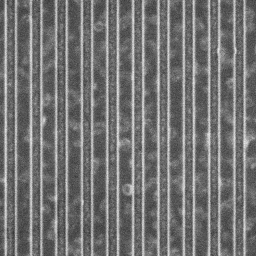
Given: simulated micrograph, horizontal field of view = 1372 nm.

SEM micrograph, parallel lines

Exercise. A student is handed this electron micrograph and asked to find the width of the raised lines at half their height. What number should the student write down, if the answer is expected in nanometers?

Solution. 88.7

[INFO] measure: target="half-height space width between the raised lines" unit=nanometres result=46.9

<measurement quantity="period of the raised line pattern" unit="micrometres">0.136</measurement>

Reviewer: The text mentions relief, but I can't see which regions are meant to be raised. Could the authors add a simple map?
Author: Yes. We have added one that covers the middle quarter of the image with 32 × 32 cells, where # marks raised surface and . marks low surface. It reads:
.###...####..####...####..####..
.###...####..####...####..####..
.###...####..####...####..####..
.###...####..####...####..####..
.###...####..####...####..####..
.###...####..####...####..####..
.###...####..####...####..####..
.###...####..####...####..####..
.###...####..####...####..####..
.###...####..####...####..####..
.###...####..####...####..####..
.###...####..####...####..####..
.###...####..####...####..####..
.###...####..####...####..####..
.###...####..####...####..####..
.###...####..####...####..####..
.###...####..####...####..####..
.###...####..####...####..####..
.###...####..####...####..####..
.###...####..####...####..####..
.###...####..####...####..####..
.###...####..####...####..####..
.###...####..####...####..####..
.###...####..####...####..####..
.###...####..####...####..####..
.###...####..####...####..####..
.###...####..####...####..####..
.###...####..####...####..####..
.###...####..####...####..####..
.###...####..####...####..####..
.###...####..####...####..####..
.###...####..####...####..####..